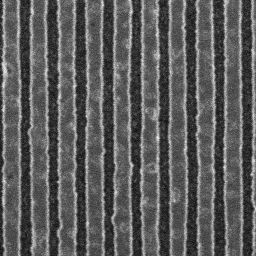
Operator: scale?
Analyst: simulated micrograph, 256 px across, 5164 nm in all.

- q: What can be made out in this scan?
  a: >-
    parallel lines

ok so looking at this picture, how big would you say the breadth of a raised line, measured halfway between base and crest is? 330 nanometres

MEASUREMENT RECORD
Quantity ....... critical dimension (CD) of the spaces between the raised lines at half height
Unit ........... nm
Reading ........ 240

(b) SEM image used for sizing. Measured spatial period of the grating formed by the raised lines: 559 nm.